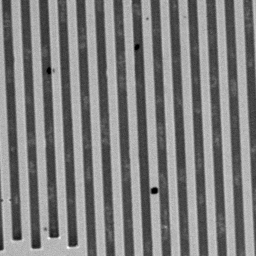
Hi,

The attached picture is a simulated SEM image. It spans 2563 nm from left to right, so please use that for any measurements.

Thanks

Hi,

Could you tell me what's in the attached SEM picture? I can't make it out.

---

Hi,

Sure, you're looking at parallel lines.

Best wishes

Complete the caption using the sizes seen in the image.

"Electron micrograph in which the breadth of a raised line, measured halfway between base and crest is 8.49 px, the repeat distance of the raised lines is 18.6 px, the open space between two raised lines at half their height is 104 nanometers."